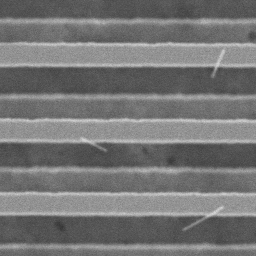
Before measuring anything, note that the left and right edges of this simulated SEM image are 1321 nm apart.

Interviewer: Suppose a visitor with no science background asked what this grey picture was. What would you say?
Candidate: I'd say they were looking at lines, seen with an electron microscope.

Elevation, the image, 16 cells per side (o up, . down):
................
oooooooooooooooo
oooooooooooooooo
oooooooooooooooo
................
................
oooooooooooooooo
oooooooooooooooo
oooooooooooooooo
................
................
oooooooooooooooo
oooooooooooooooo
.............o..
................
oooooooooooooooo